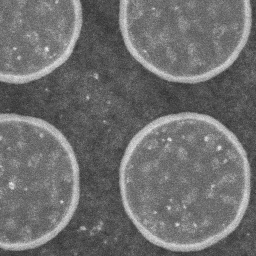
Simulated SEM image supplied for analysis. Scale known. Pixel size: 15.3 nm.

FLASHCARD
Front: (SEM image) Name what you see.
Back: raised bodies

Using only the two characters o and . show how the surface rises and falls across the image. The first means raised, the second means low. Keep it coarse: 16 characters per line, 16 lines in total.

ooooo...oooooooo
ooooo...oooooooo
ooooo...ooooooo.
oooo.....oooooo.
ooo.......oooo..
................
................
oo........ooo...
oooo.....ooooo..
oooo....ooooooo.
ooooo...ooooooo.
ooooo...ooooooo.
ooooo...ooooooo.
oooo....ooooooo.
ooo......ooooo..
...........o....